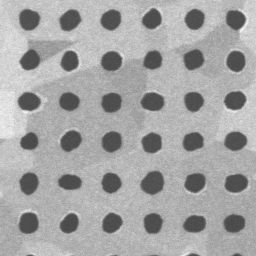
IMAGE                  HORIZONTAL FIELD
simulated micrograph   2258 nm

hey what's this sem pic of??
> a regular array of holes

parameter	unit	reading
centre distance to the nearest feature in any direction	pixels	40.1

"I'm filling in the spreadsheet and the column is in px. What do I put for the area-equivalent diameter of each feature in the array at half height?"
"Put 20.5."